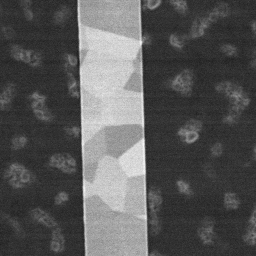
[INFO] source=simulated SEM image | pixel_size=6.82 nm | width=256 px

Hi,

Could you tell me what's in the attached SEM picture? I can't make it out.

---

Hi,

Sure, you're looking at one or a few lines or trenches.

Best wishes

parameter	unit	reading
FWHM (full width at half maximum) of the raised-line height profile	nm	420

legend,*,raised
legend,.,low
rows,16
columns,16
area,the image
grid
.....****.......
.....****.......
.....****.......
.....****.......
.....****.......
.....****.......
.....****.......
.....****.......
.....****.......
.....****.......
.....****.......
.....****.......
.....****.......
.....****.......
.....****.......
.....****.......